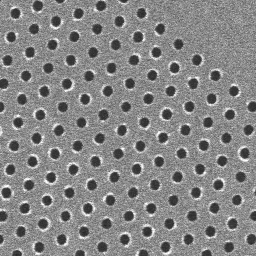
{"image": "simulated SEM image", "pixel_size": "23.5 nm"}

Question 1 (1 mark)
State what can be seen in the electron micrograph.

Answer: a regular array of holes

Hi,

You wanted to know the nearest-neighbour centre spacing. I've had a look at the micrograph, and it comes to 552 nanometers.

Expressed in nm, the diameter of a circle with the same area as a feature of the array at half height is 254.